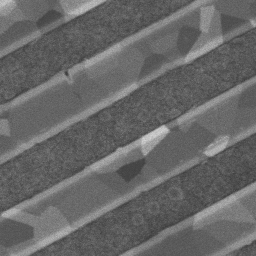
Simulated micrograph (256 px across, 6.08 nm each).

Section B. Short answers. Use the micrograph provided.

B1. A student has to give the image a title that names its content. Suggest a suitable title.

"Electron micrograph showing one or a few lines or trenches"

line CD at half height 260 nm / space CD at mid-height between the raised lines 312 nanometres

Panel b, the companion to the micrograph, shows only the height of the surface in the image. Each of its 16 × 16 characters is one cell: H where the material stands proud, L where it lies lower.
HHHHHLLLLLLLHHHH
HHHLLLLLLLHHHHHH
HHLLLLLLHHHHHHLL
LLLLLLHHHHHHLLLL
LLLLLHHHHHLLLLLL
LLLHHHHHLLLLLLLH
LHHHHHLLLLLLLHHH
HHHHHLLLLLLHHHHH
HHHLLLLLLHHHHHHL
HLLLLLLLHHHHHLLL
LLLLLLHHHHHLLLLL
LLLLHHHHHHLLLLLL
LLHHHHHHLLLLLLHH
HHHHHHLLLLLLLHHH
HHHHLLLLLLLHHHHH
HHLLLLLLLHHHHHLL